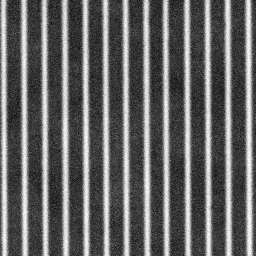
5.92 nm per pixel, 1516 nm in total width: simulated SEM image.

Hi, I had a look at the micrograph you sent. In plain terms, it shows parallel lines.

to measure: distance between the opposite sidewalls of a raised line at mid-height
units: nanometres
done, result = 21.5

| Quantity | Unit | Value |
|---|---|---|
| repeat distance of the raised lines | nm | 121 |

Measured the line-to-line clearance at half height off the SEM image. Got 97.6 nanometers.